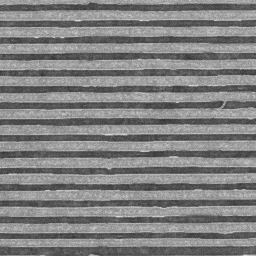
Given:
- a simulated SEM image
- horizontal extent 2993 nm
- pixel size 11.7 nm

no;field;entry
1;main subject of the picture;parallel lines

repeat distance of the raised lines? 190 nm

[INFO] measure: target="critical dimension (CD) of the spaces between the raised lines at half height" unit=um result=0.0862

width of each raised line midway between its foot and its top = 107 nm